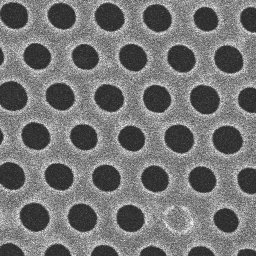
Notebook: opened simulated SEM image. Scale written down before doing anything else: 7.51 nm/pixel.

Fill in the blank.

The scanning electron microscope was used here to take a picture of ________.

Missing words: a regular array of holes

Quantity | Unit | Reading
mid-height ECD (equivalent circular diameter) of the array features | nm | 211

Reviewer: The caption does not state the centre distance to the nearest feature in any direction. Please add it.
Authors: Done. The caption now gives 0.348 um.